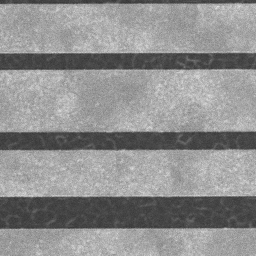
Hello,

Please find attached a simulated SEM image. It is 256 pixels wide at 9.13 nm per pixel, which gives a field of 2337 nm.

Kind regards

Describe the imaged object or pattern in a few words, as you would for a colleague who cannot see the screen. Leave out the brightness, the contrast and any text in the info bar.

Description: one or a few lines or trenches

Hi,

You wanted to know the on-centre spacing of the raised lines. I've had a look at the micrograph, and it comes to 661 nm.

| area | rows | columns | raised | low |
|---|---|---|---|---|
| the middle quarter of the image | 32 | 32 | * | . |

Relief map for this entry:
..............................**
................................
********************************
********************************
********************************
********************************
********************************
********************************
********************************
********************************
********************************
********************************
********************************
********************************
********************************
********************************
********************************
................................
................................
................................
................................
................................
********************************
********************************
********************************
********************************
********************************
********************************
********************************
********************************
********************************
********************************